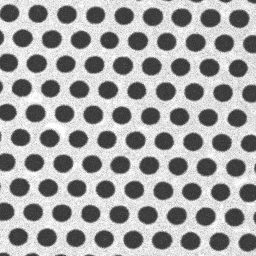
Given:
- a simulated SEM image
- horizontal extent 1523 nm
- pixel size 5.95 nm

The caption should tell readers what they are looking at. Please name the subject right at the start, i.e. a regular array of holes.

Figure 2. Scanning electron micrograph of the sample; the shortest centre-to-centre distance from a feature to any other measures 169 nanometres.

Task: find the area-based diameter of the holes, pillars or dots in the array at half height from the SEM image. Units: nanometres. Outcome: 113